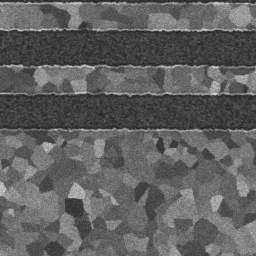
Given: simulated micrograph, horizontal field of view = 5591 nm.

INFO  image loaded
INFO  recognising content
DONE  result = one or a few lines or trenches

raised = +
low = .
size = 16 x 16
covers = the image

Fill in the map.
++++++++++++++++
++++++++++++++++
................
................
++++++++++++++++
++++++++++++++++
................
................
++++++++++++++++
++++++++++++++++
++++++++++++++++
++++++++++++++++
++++++++++++++++
++++++++++++++++
++++++++++++++++
++++++++++++++++